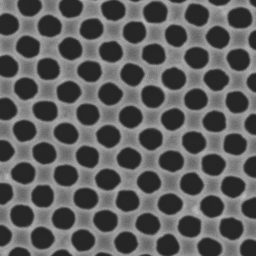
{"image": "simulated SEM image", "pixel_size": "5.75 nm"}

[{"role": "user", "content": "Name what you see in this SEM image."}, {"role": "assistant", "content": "a regular array of holes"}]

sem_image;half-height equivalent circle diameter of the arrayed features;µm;0.131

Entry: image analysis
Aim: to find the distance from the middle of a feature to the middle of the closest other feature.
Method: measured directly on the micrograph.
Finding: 167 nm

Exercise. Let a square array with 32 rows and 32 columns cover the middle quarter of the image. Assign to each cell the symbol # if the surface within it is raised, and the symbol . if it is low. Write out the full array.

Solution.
####.....######....############.
###......#####......######...###
####.....#####......#####.....##
####.....#####......####.......#
...###.########....######.....##
....######...####.###.###.....##
....#####.....######....########
....#####......####......#####..
....#####.....#####......#####..
...#######....######.....#####..
####....########.####...#######.
###.....#######....#######...###
###......#####.....######.....##
###......#####......####......##
####....######.....#####......##
..########..###...#######....###
...######.....######...###..####
....####......#####.....######..
....####......#####......#####..
...######.....#####......####...
#####.####...#######....######..
####....######....###..#######..
###......#####.....######....###
###......####......#####......##
###.....#####......#####......##
..###...######.....#####......##
...######...##############...###
...#####.....######....#######..
....####......####......#####...
...#####......####......#####...
.#######.....######.....#####...
###....####.#######....######...